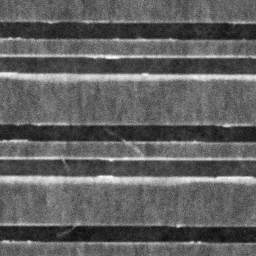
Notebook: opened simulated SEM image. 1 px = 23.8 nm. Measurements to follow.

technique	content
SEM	lines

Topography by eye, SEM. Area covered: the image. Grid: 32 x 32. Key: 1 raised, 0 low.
11111111111111111111111111111111
11111111111111111111111111111111
11111111111111111111111111111111
00000000000000000000000000000000
00000000000000000000000000000000
11111111111111111111111111111111
11111111111111111111111111111111
00000000000000000000000000000000
00000000000000000000000000000000
11111000000000000000000000000000
11111111111111111111111111111111
11111111111111111111111111111111
11111111111111111111111111111111
11111111111111111111111111111111
11111111111111111111111111111111
00101111111111111111111111111111
00000000000000000000000000000000
00000000000000000000000000000000
11111111111111111111111111111111
11111111111111111111111111111111
00000000000000000000000000000000
00000000000000000000000000000000
11111111111111110110001111111000
11111111111111111111111111111111
11111111111111111111111111111111
11111111111111111111111111111111
11111111111111111111111111111111
11111111111111111111111111111111
00000000000000000000000000000000
00000000000000000000000000000000
11111111111111111111111111111111
11111111111111111111111111111111